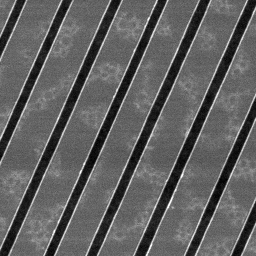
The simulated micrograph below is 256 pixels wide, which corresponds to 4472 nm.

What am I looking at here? parallel lines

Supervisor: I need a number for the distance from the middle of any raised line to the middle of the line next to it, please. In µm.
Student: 0.744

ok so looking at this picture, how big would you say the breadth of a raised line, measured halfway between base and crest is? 186 nanometers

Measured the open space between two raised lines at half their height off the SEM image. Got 32.1 pixels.